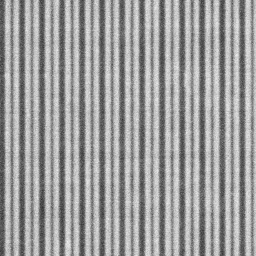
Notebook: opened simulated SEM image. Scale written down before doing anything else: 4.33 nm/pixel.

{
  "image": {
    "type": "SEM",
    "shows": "parallel lines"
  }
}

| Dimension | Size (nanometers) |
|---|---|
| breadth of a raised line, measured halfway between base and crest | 22.7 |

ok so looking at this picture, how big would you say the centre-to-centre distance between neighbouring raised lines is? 43.4 nanometres